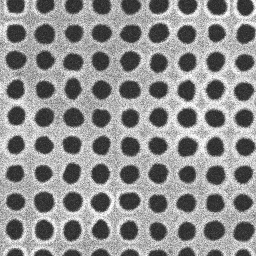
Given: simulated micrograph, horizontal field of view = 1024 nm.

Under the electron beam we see a regular array of holes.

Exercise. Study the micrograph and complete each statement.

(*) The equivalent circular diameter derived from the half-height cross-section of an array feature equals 76.1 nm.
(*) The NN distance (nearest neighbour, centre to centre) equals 110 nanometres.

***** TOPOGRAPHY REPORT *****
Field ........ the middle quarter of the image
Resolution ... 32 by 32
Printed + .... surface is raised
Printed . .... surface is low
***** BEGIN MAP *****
.....++....+++.....++.....+++...
+...++++..+++++..+++++...+++++..
++++++++++++++++++++++++++++++++
++++++++++++++++++++++++++++++++
+...++++...++++...+++++..+++++..
....+++.....++.....+++....+++...
.....++.....++.....++.....++....
....+++.....++.....++.....++....
+..+++++..+++++...+++++..++++...
++++++++++++++++++++++++++++++++
++++++++++++++++++++++++++++++++
+...++++...+++++..++++...++++...
.....++....+++.....+++....+++...
.....++.....++.....++.....++....
.....++....+++....++++....+++...
+...++++..+++++...+++++..+++++..
++++++++++++++++++++++++++++++++
++++++++++++++++++++++++++++++++
...+++++...++++...++++...+++++..
....+++....+++.....++.....+++...
....+++....+++.....++.....+++...
....+++....+++.....++.....++....
++.+++++...++++...+++++..++++...
++++++++++++++++++++++++++++++++
++++++++++++++++++++++++++++++++
+...++++..+++++...++++...+++++..
....+++....+++.....++.....+++...
....+++.....++.....++.....+++...
....+++....+++.....++.....+++...
...+++++...++++...++++...+++++..
++++++++++++++++++++++++++++++++
++++++++++++++++++++++++++++++++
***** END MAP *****